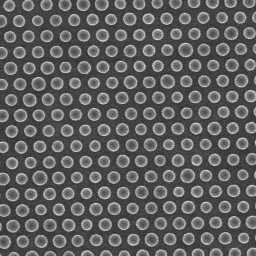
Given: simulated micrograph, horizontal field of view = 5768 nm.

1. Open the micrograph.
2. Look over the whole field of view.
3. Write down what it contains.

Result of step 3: a regular array of raised bodies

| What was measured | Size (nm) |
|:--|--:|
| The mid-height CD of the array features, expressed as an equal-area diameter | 259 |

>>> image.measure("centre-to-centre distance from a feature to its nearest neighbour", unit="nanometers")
402